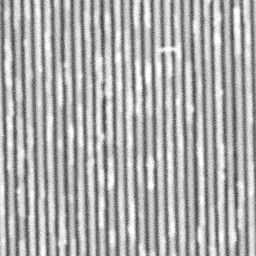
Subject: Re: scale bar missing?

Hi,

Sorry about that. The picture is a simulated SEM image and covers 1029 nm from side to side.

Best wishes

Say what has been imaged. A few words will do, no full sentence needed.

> parallel lines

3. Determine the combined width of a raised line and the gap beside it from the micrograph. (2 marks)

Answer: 40.1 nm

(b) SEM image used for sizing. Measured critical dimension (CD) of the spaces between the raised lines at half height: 22.1 nm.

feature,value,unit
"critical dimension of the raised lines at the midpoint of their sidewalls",0.0186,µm